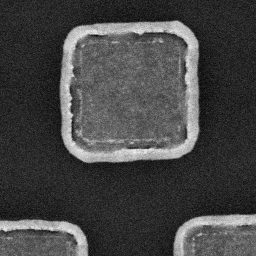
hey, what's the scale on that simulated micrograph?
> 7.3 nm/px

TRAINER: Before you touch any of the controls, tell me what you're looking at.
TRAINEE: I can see raised bodies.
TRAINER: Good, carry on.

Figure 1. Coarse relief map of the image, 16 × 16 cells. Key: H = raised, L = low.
LLLLLLLLLLLLLLLL
LLLLLLLLLLLLLLLL
LLLLLHHHHHHHLLLL
LLLLHHHHHHHHLLLL
LLLLHHHHHHHHLLLL
LLLLHHHHHHHHLLLL
LLLLHHHHHHHHLLLL
LLLLHHHHHHHHLLLL
LLLLHHHHHHHHLLLL
LLLLLHHHHHHLLLLL
LLLLLLLLLLLLLLLL
LLLLLLLLLLLLLLLL
LLLLLLLLLLLLLLLL
LLLLLLLLLLLLLLLL
HHHHHLLLLLLHHHHH
HHHHHLLLLLLHHHHH